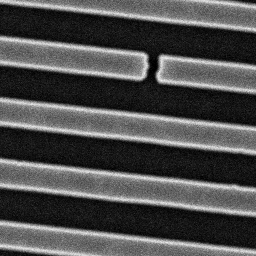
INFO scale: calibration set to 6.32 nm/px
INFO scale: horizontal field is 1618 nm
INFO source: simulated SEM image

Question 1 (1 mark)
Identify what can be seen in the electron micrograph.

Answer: one or a few lines or trenches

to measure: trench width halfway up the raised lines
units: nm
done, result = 217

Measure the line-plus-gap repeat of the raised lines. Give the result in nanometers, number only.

385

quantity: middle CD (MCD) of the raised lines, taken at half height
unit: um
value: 0.167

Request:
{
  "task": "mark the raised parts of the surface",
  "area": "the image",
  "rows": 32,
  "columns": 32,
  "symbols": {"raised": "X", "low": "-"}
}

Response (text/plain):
--XXXXXXXXXXXXXXXXXXXXXXXXXXXX--
-----------XXXXXXXXXXXXXXXXXXXXX
--------------------XXXXXXXXXXXX
-----------------------------XXX
--------------------------------
XXXXXXXX------------------------
XXXXXXXXXXXXXXXXX---------------
XXXXXXXXXXXXXXXXXX--XXXX--------
----XXXXXXXXXXXXXX--XXXXXXXXXXXX
-------------XXXXX--XXXXXXXXXXXX
----------------------XXXXXXXXXX
-------------------------------X
X-------------------------------
XXXXXXXXXX----------------------
XXXXXXXXXXXXXXXXXXX-------------
XXXXXXXXXXXXXXXXXXXXXXXXXXXX----
-------XXXXXXXXXXXXXXXXXXXXXXXXX
-----------------XXXXXXXXXXXXXXX
-------------------------XXXXXXX
--------------------------------
XXXX----------------------------
XXXXXXXXXXXXX-------------------
XXXXXXXXXXXXXXXXXXXXXXX---------
--XXXXXXXXXXXXXXXXXXXXXXXXXXXXX-
----------XXXXXXXXXXXXXXXXXXXXXX
-------------------XXXXXXXXXXXXX
----------------------------XXXX
--------------------------------
XXXXXXX-------------------------
XXXXXXXXXXXXXXXX----------------
XXXXXXXXXXXXXXXXXXXXXXXXX-------
-----XXXXXXXXXXXXXXXXXXXXXXXXXXX